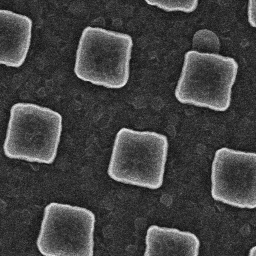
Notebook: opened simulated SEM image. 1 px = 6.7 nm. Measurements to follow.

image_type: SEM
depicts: raised bodies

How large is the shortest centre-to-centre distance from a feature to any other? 103 px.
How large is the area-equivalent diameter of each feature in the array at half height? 384 nanometers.